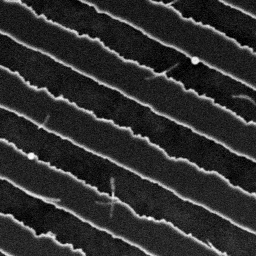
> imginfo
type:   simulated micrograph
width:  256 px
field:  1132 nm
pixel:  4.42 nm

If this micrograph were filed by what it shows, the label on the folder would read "lines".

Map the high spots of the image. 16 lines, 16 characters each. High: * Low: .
**....*****....*
****....*****...
.*****....*****.
...*****....****
*....*****....**
***....*****....
*****....*****..
..*****....****.
....*****....***
**....****.....*
****....*****...
.****.....*****.
...*****....****
*....****.....**
**.....****.....
*****....****...